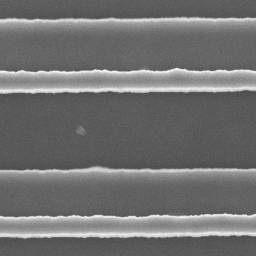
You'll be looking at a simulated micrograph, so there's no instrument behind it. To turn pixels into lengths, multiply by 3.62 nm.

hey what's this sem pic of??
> lines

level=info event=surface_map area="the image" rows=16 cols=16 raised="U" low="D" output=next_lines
DDDDDDDDDDDDDDDD
UUUUUUUUUUUUUUUU
UUUUUUUUUUUUUUUU
UUUUUUUUUUUUUUUU
UUUUUUUUUUUUUUUU
UUUUUUUUUUUUUUUU
DDDDDDDDDDDDDDDD
DDDDDDDDDDDDDDDD
DDDDDDDDDDDDDDDD
DDDDDDDDDDDDDDDD
DDDDDDDDDDDDDDDD
UUUUUUUUUUUUUUUU
UUUUUUUUUUUUUUUU
UUUUUUUUUUUUUUUU
UUUUUUUUUUUUUUUU
DDDDDDDDDDDDDDDD